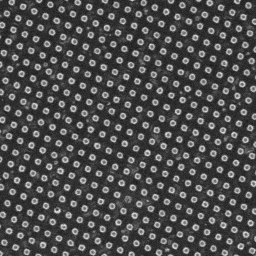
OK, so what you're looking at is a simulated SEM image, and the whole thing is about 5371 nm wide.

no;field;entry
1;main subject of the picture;a regular array of raised bodies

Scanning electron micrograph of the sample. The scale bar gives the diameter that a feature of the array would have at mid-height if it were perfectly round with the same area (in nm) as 116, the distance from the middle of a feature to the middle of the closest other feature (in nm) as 253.